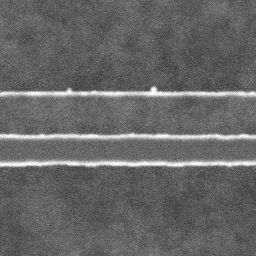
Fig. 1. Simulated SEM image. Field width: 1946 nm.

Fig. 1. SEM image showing lines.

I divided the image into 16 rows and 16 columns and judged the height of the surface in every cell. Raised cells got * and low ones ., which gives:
................
................
................
................
................
................
****************
****************
****************
****************
................
................
................
................
................
................